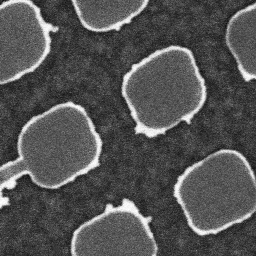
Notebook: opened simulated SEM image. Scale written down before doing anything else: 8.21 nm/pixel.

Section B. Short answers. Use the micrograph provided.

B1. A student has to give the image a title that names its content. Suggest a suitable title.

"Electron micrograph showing raised bodies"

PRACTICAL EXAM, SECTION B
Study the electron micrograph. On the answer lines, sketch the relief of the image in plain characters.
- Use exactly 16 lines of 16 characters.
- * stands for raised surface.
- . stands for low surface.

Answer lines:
**...****......*
***..***......**
***...........**
***......***...*
**......****...*
........*****...
....*...*****...
..****..****....
.*****..........
.*****........*.
******......****
*.**.......*****
...........*****
......***...****
.....****...**..
....******......